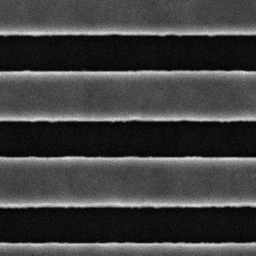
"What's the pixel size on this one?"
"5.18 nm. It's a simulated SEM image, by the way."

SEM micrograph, lines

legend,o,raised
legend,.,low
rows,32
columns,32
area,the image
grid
oooooooooooooooooooooooooooooooo
oooooooooooooooooooooooooooooooo
oooooooooooooooooooooooooooooooo
oooooooooooooooooooooooooooooooo
................................
................................
................................
................................
................................
oooooooooooooooooooooooooooooooo
oooooooooooooooooooooooooooooooo
oooooooooooooooooooooooooooooooo
oooooooooooooooooooooooooooooooo
oooooooooooooooooooooooooooooooo
oooooooooooooooooooooooooooooooo
................................
................................
................................
................................
................................
oooooooooooooooooooooooooooooooo
oooooooooooooooooooooooooooooooo
oooooooooooooooooooooooooooooooo
oooooooooooooooooooooooooooooooo
oooooooooooooooooooooooooooooooo
oooooooooooooooooooooooooooooooo
................................
................................
................................
................................
oooooooooooooooooooooooooooooooo
oooooooooooooooooooooooooooooooo